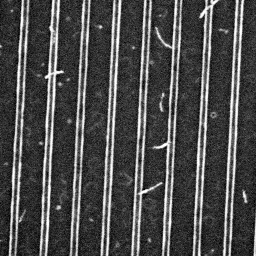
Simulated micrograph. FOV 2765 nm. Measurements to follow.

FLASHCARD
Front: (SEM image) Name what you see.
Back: parallel lines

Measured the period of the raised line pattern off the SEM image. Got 330 nm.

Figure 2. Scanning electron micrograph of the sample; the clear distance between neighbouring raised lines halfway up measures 260 nanometers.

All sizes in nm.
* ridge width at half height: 63.4